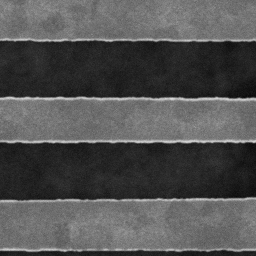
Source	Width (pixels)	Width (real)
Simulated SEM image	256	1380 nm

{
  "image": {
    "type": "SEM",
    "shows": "lines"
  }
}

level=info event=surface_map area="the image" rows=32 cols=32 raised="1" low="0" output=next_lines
11111111111111111111111111111111
11111111111111111111111111111111
11111111111111111111111111111111
11111111111111111111111111111111
11111111111111111111111111111111
00000000000000000000000000000000
00000000000000000000000000000000
00000000000000000000000000000000
00000000000000000000000000000000
00000000000000000000000000000000
00000000000000000000000000000000
00000000000000000000000000000000
11111111111111111111111111111111
11111111111111111111111111111111
11111111111111111111111111111111
11111111111111111111111111111111
11111111111111111111111111111111
11111111111111111111111111111111
00000000000000000000000000000000
00000000000000000000000000000000
00000000000000000000000000000000
00000000000000000000000000000000
00000000000000000000000000000000
00000000000000000000000000000000
00000000000000000000000000000000
11111111111111111111111111111111
11111111111111111111111111111111
11111111111111111111111111111111
11111111111111111111111111111111
11111111111111111111111111111111
11111111111111111111111111111111
00000000000000000000000000000000